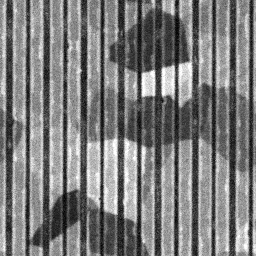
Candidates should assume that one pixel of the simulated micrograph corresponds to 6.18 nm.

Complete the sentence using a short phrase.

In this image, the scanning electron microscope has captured parallel lines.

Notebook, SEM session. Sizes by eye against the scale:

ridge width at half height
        0.0711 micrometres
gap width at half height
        47.1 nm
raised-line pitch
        115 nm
